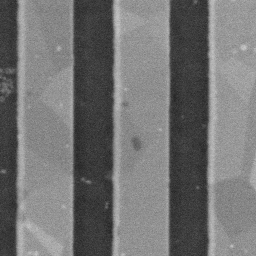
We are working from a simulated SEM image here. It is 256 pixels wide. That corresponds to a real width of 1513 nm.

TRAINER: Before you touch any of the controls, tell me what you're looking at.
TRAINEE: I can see lines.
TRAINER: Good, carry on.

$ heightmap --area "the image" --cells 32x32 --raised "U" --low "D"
DDUUUUUUUDDDDDUUUUUUUDDDDDUUUUUU
DDUUUUUUUDDDDDUUUUUUUDDDDDUUUUUU
DDUUUUUUUDDDDDUUUUUUUDDDDDUUUUUU
DDUUUUUUUDDDDDUUUUUUUDDDDDUUUUUU
DDUUUUUUUDDDDDUUUUUUUDDDDDUUUUUU
DDUUUUUUUDDDDDUUUUUUUDDDDDUUUUUU
DDUUUUUUUDDDDDUUUUUUUDDDDDUUUUUU
DDUUUUUUUDDDDDUUUUUUUDDDDDUUUUUU
DDUUUUUUUDDDDDUUUUUUUDDDDDUUUUUU
DDUUUUUUUDDDDDUUUUUUUDDDDDUUUUUU
DDUUUUUUUDDDDDUUUUUUUDDDDDUUUUUU
DDUUUUUUUDDDDDUUUUUUUDDDDDUUUUUU
DDUUUUUUUDDDDDUUUUUUUDDDDDUUUUUU
DDUUUUUUUDDDDDUUUUUUUDDDDDUUUUUU
DDUUUUUUUDDDDDUUUUUUUDDDDDUUUUUU
DDUUUUUUUDDDDDUUUUUUUDDDDDUUUUUU
DDUUUUUUUDDDDDUUUUUUUDDDDDUUUUUU
DDUUUUUUUDDDDDUUUUUUUDDDDDUUUUUU
DDUUUUUUUDDDDDUUUUUUUDDDDDUUUUUU
DDUUUUUUUDDDDDUUUUUUUDDDDDUUUUUU
DDUUUUUUUDDDDDUUUUUUUDDDDDUUUUUU
DDUUUUUUUDDDDDUUUUUUUDDDDDUUUUUU
DDUUUUUUUDDDDDUUUUUUUDDDDDUUUUUU
DDUUUUUUUDDDDDUUUUUUUDDDDDUUUUUU
DDUUUUUUUDDDDDUUUUUUUDDDDDUUUUUU
DDUUUUUUUDDDDDUUUUUUUDDDDDUUUUUU
DDUUUUUUUDDDDDUUUUUUUDDDDDUUUUUU
DDUUUUUUUDDDDDUUUUUUUDDDDDUUUUUU
DDUUUUUUUDDDDDUUUUUUUDDDDDUUUUUU
DDUUUUUUUDDDDDUUUUUUUDDDDDUUUUUU
DDUUUUUUUDDDDDUUUUUUUDDDDDUUUUUU
DDUUUUUUUDDDDDUUUUUUUDDDDDUUUUUU